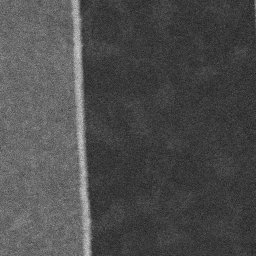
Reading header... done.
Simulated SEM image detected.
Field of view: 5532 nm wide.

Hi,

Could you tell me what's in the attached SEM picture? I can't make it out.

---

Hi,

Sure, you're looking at one or a few lines or trenches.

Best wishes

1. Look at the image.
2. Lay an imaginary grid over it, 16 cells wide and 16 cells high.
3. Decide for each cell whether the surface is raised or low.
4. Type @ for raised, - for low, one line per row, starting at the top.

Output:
@@@@@-----------
@@@@@-----------
@@@@@-----------
@@@@@-----------
@@@@@-----------
@@@@@-----------
@@@@@-----------
@@@@@-----------
@@@@@-----------
@@@@@-----------
@@@@@-----------
@@@@@-----------
@@@@@-----------
@@@@@-----------
@@@@@-----------
@@@@@-----------